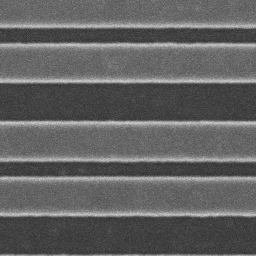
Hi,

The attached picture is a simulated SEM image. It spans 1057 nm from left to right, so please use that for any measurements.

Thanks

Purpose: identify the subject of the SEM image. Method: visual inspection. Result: one or a few lines or trenches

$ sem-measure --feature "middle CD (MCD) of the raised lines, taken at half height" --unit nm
160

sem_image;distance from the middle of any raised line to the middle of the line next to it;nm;276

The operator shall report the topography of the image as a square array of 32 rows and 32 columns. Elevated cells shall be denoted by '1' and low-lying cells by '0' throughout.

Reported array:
11111111111111111111111111111111
11111111111111111111111111111111
11111111111111111111111111111111
00000000000000000000000000000000
00000000000000000000000000000000
00000000000000000000000000000000
11111111111111111111111111111111
11111111111111111111111111111111
11111111111111111111111111111111
11111111111111111111111111111111
00000000000000000000000000000000
00000000000000000000000000000000
00000000000000000000000000000000
00000000000000000000000000000000
00000000000000000000000000000000
11111111111111111111111111111111
11111111111111111111111111111111
11111111111111111111111111111111
11111111111111111111111111111111
11111111111111111111111111111111
00000000000000000000000000000000
00000000000000000000000000000000
11111111111111111111111111111111
11111111111111111111111111111111
11111111111111111111111111111111
11111111111111111111111111111111
11111111111111111111111111111111
00000000000000000000000000000000
00000000000000000000000000000000
00000000000000000000000000000000
00000000000000000000000000000000
00000000000000000000000000000000